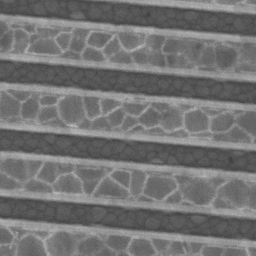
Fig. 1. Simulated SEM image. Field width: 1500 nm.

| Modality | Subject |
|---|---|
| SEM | one or a few lines or trenches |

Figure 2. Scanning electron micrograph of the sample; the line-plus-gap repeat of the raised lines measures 0.399 micrometres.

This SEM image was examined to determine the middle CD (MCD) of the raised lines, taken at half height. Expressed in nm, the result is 229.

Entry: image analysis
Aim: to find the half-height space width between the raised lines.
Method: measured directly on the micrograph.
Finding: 166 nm